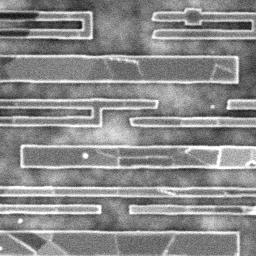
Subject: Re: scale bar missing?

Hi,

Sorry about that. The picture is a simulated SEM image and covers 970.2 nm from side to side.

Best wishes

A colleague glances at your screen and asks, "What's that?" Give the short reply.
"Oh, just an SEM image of wiring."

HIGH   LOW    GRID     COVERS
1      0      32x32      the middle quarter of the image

11111111111111111111111111111111
11111111111111111111111111111111
11111111111111111111111111111111
11111111111111111111111111111111
00000000000000000000000000001111
00000000000000000000000000000000
00000000000000000000000000000000
00000000000000000000000000000000
00000000000000000000000000000000
11111111111111111111111000000000
11111111111111111111111000000000
00000001100000000000000000000000
00000001100000000000000000000000
11111111100000000111111111111100
11111111100000000111111111111111
01111111100000000001111111111111
00000000000000000000000000000000
00000000000000000000000000000000
00000000000000000000000000000000
00000000000000000000000000000000
00000000000000000000000000000000
11111111111111111111111111111111
11111111111111111111111111111111
11111111111111111111111111111111
11111111111111111111111111111111
11111111111111111111111111111111
00000000000000000000000000000000
00000000000000000000000000000000
00000000000000000000000000000000
00000000000000000000000000000000
00000000000000000000000000000000
11111111111111111111111111111111